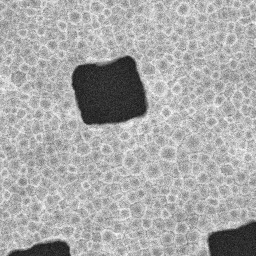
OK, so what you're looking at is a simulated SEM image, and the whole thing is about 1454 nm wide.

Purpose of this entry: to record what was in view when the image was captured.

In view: holes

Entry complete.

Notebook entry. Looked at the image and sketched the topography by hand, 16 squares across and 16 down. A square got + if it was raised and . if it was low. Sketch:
++++++++++++++++
++++++++++++++++
++++++++++++++++
++++++++++++++++
+++++....+++++++
+++++....+++++++
+++++....+++++++
+++++...++++++++
++++++++++++++++
++++++++++++++++
++++++++++++++++
++++++++++++++++
++++++++++++++++
++++++++++++++++
+++++++++++++...
++..+++++++++...